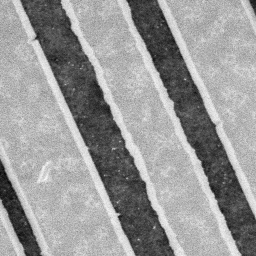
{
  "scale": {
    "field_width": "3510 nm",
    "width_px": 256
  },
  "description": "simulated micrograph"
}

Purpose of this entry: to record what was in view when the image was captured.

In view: one or a few lines or trenches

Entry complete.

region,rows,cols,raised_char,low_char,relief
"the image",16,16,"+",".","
+...++++..++++++
++...+++...+++++
++...++++..+++++
+++...+++...++++
+++...++++..++++
+++....+++...+++
++++...+++...+++
++++...++++...++
+++++...+++...++
+++++...++++..++
++++++...+++...+
.+++++...++++..+
.++++++...+++...
..+++++...++++..
+.+++++....+++..
+..+++++...++++.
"